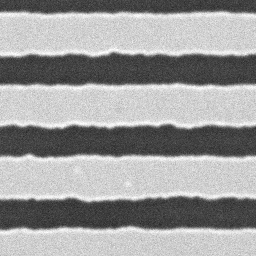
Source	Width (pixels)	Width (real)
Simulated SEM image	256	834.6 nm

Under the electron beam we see lines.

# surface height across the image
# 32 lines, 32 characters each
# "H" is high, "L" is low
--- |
LLLLLLLLLLLLLLLLLLLLLLLLLLLLLLLL
LLLLLLLLLLLLLLLLLLLLLLLLLLLLLLLL
HHHHHHHHHHHHHHHHHHHHHHHHHHHHHHHH
HHHHHHHHHHHHHHHHHHHHHHHHHHHHHHHH
HHHHHHHHHHHHHHHHHHHHHHHHHHHHHHHH
HHHHHHHHHHHHHHHHHHHHHHHHHHHHHHHH
HHHHHHHHHHHHHHLHHHHHHHHHHHHHHHHH
LLLLLLLLLLLLLLLLLLLLLLLLLLLLLLLL
LLLLLLLLLLLLLLLLLLLLLLLLLLLLLLLL
LLLLLLLLLLLLLLLLLLLLLLLLLLLLLLLL
LLLLLLLLLLLLLLLLLLLLLLLLLLLLLLLL
HHHHHHHHHHHHHHHHHHHHHHHHHHHHHHHH
HHHHHHHHHHHHHHHHHHHHHHHHHHHHHHHH
HHHHHHHHHHHHHHHHHHHHHHHHHHHHHHHH
HHHHHHHHHHHHHHHHHHHHHHHHHHHHHHHH
HLHHHHHHHHHHHHHHHHHHLHHHHHLHHHHH
LLLLLLLLLLLLLLLLLLLLLLLLLLLLLLLL
LLLLLLLLLLLLLLLLLLLLLLLLLLLLLLLL
LLLLLLLLLLLLLLLLLLLLLLLLLLLLLLLL
LLLHLLLLLHHHLLLLLLLLLLLLLHLLLLLL
HHHHHHHHHHHHHHHHHHHHHHHHHHHHHHHH
HHHHHHHHHHHHHHHHHHHHHHHHHHHHHHHH
HHHHHHHHHHHHHHHHHHHHHHHHHHHHHHHH
HHHHHHHHHHHHHHHHHHHHHHHHHHHHHHHH
HHHHHHHHHHHHHHHHHHHHHLLLLHHHHHHH
LLLLLLLLLLLLLLLLLLLLLLLLLLLLLLLL
LLLLLLLLLLLLLLLLLLLLLLLLLLLLLLLL
LLLLLLLLLLLLLLLLLLLLLLLLLLLLLLLL
LLLLLLLLLLLLLLLHHLLLLLLLLLLLLLLL
HHHHHHHHHHHHHHHHHHHHHHHHHHHHHHHH
HHHHHHHHHHHHHHHHHHHHHHHHHHHHHHHH
HHHHHHHHHHHHHHHHHHHHHHHHHHHHHHHH